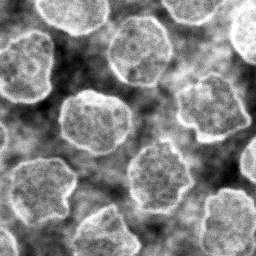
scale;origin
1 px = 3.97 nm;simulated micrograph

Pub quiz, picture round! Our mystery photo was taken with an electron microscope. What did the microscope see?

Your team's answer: raised bodies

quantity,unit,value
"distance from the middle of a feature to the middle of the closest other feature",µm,0.334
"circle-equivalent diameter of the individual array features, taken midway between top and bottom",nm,254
